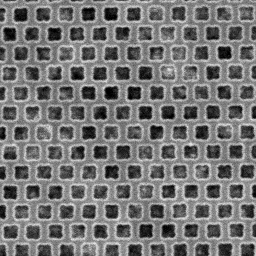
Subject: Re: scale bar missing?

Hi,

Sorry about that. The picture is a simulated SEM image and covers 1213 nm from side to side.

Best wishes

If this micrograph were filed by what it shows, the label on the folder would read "a regular array of holes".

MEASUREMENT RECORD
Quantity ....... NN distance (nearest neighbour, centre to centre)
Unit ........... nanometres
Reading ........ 105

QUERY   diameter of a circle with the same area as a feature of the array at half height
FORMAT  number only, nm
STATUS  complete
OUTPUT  77.3